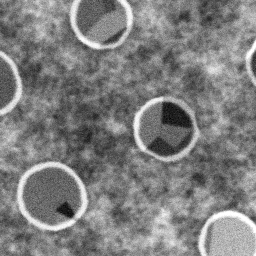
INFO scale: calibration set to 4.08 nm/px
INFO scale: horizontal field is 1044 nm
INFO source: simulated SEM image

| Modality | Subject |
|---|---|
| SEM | raised bodies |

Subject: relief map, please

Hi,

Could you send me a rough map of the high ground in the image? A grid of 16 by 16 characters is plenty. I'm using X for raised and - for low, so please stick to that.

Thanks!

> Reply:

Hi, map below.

-----XXX--------
-----XXX--------
-----XXX--------
----------------
X---------------
X---------------
X--------XX-----
---------XXX----
---------XXX----
---------XXX----
--XX------------
-XXXX-----------
-XXXX-----------
--XXX---------X-
-------------XXX
-------------XXX